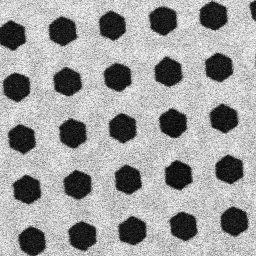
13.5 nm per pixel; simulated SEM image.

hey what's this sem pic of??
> a regular array of holes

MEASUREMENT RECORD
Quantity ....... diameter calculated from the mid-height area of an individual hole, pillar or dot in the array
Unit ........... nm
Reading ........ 380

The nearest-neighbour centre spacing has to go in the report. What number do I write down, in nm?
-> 681